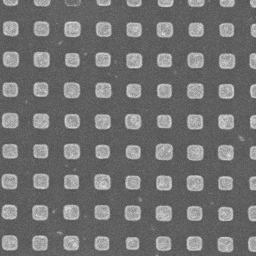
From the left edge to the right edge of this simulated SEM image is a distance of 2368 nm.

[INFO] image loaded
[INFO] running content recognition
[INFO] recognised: a regular array of raised bodies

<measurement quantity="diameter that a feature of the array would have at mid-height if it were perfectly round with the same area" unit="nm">147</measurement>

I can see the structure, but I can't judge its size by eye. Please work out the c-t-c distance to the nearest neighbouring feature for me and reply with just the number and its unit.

30.3 px